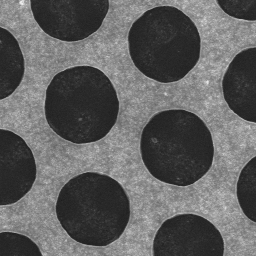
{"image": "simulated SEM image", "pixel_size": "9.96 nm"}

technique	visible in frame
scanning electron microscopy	holes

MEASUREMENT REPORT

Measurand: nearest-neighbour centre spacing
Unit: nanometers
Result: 1030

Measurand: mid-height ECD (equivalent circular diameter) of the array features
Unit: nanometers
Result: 746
